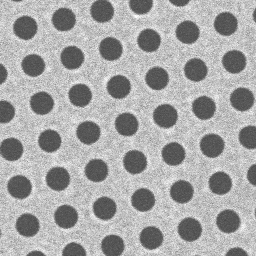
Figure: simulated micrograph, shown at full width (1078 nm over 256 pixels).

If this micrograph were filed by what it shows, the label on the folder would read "a regular array of holes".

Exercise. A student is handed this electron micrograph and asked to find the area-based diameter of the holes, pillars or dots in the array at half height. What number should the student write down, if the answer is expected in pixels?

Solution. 24.2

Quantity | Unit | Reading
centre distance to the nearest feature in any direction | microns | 0.162